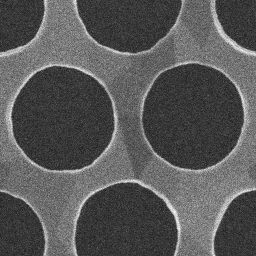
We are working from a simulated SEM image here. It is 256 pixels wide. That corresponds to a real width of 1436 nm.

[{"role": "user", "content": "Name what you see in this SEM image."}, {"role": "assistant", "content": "holes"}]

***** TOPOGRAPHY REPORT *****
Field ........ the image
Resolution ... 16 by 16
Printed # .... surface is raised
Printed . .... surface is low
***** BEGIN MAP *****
...##......##...
...##......###..
..####....#####.
################
##...#####....##
#......##......#
#......##......#
#......##......#
#......##......#
#.....####....##
###..######..###
#######..#######
.####.....#####.
..###......###..
...##......##...
...##......##...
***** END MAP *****